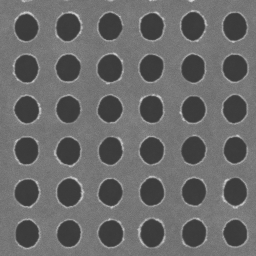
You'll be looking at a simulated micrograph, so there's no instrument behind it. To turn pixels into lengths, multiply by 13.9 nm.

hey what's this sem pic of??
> a regular array of holes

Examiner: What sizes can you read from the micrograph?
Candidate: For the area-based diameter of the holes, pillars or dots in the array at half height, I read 25.6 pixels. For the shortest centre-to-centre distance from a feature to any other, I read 574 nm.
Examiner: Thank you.